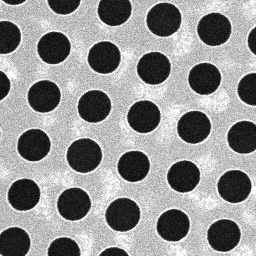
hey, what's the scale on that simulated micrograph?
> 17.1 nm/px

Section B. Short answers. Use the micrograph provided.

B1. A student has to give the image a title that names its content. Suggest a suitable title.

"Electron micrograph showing a regular array of holes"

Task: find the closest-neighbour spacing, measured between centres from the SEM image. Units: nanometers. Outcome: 849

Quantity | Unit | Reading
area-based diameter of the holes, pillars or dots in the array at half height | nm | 577